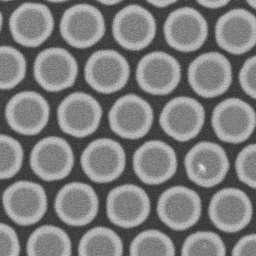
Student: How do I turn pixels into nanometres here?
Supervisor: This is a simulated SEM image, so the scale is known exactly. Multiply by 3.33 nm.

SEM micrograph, an array of small figures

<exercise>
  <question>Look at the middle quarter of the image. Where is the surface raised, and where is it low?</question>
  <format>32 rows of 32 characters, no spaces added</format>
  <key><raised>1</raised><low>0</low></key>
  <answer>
11100111111111110011111111111001
11100111111111110011111111111001
11100111111111110011111111111001
11100111111111110011111111111001
11100011111111110011111111111001
11000001111111100001111111110000
00000000111110000000111111100000
00111100000000000000001111000000
11111110000000111110000000001111
11111111000001111111100000111111
11111111100011111111100001111111
11111111100011111111110001111111
11111111100111111111110011111111
11111111100111111111110011111111
11111111100111111111110011111111
11111111100011111111110011111111
11111111000011111111100001111111
01111100000001111111000000111111
00000000000000001110000000011111
10000001111110000000011100000000
10000011111111000001111111000000
11000111111111100011111111100000
11000111111111100111111111110001
11001111111111100111111111110011
11001111111111100111111111110011
11001111111111100111111111110011
11000111111111100011111111110001
10000111111111000011111111100001
00000011111110000001111111000001
00000000011000000000111110000000
11111100000000111100000000000000
11111110000011111111000000111111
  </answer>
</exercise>